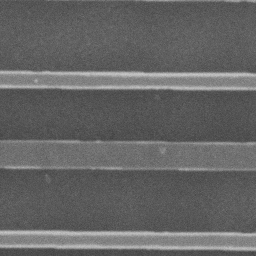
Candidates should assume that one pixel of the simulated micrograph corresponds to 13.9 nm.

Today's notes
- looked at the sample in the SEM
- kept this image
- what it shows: lines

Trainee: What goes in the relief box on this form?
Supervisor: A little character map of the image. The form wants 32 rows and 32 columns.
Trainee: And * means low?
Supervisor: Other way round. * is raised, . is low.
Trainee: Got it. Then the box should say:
................................
................................
................................
................................
................................
................................
................................
................................
................................
********************************
********************************
................................
................................
................................
................................
................................
................................
................................
********************************
********************************
********************************
................................
................................
................................
................................
................................
................................
................................
................................
********************************
********************************
................................